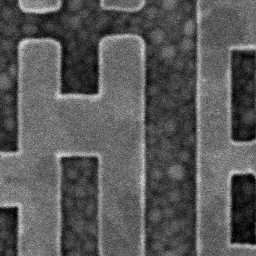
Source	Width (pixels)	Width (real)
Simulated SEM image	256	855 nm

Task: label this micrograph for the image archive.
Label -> one or a few lines or trenches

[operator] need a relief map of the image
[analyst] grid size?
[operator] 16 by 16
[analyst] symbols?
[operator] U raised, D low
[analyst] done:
DDUDDDDUUDDDUUUU
DDDDDDDDDDDDUUUU
DDUDDDDUUDDDUUUU
DUUUDDUUUDDDUUDD
DUUUDDUUUDDDUUDD
DUUUDDUUUDDDUUDD
DUUUUUUUUDDDUUDD
DUUUUUUUUDDDUUDD
DUUUUUUUUDDDUUDD
DUUUUUUUUDDDUUUU
UUUUDDUUUDDDUUUU
UUUUDDUUUDDDUUDD
UUUUDDUUUDDDUUDD
DUUUDDUUUDDDUUDD
DUUUDDUUUDDDUUDD
DUUUDDUUUDDDUUUU